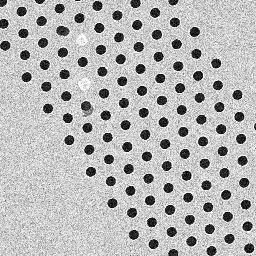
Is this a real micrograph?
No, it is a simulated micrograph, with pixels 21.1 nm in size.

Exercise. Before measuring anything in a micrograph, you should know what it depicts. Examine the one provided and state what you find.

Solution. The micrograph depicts a regular array of holes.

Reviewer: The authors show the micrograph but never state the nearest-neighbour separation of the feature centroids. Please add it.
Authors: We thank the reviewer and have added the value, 458 nm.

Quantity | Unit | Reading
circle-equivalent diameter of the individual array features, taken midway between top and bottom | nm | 212